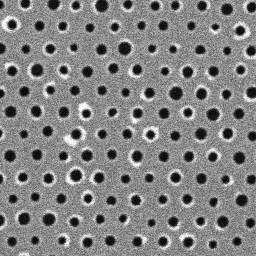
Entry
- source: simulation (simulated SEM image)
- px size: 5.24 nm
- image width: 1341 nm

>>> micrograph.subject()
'a regular array of holes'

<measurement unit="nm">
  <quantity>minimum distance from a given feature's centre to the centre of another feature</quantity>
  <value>121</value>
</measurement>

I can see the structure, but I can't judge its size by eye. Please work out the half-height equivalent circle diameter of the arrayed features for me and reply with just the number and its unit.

52.2 nm